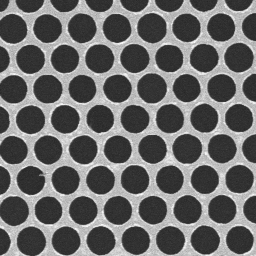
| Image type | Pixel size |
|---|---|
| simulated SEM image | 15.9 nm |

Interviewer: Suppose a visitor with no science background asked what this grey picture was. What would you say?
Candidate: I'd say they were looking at a regular array of holes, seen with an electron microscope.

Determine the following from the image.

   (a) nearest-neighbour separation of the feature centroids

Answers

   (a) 549 nm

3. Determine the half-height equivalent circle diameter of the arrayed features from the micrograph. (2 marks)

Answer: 457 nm